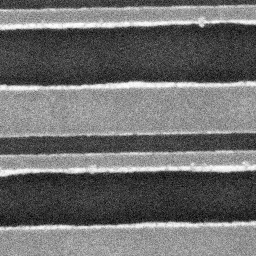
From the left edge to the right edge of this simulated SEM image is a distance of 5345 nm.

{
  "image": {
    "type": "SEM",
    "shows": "lines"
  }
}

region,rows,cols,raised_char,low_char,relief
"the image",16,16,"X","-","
XXXXXXXXXXXXXXXX
XXXXXXX---------
----------------
----------------
----------------
-----XXXXXXXXXXX
XXXXXXXXXXXXXXXX
XXXXXXXXXXXXXXXX
XXXXXXXXXXXXXXXX
XXXXXXXXXXXXXXXX
XXXXXXXXXXXXXX-X
----------------
----------------
----------------
XXXXXXXXXXXXXXXX
XXXXXXXXXXXXXXXX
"